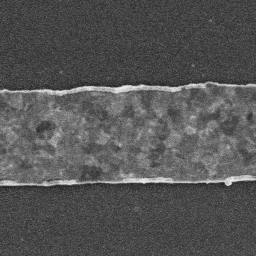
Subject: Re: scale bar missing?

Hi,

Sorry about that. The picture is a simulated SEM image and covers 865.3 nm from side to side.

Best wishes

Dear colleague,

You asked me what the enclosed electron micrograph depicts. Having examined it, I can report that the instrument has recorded one or a few lines or trenches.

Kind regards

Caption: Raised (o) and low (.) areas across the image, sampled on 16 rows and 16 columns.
................
................
................
................
................
.....ooooooooooo
oooooooooooooooo
oooooooooooooooo
oooooooooooooooo
oooooooooooooooo
oooooooooooooooo
oooo............
................
................
................
................